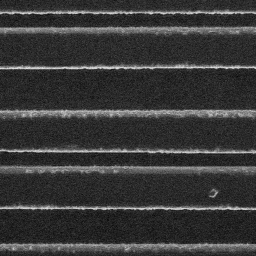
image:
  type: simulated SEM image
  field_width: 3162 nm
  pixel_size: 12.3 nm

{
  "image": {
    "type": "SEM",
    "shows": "lines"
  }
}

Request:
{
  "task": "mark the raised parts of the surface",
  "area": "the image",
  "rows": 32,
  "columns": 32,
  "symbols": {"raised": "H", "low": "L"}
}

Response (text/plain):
HHHHHHHHHHHHHHHHHHHHHHHHHHHHHHHH
HHHHHHHHHHHHHHHHHHHHHHHHHHHHHHHH
LLLLLLLLLLLLLLLLLLLLLLLLLLLLLLLL
LLLLLLLLLLLLLLLLLLLLLLLLLLLLLLLL
HHHHHHHHHHHHHHHHHHHHHHHHHHHHHHHH
HHHHHHHHHHHHHHHHHHHHHHHHHHHHHHHH
HHHHHHHHHHHHHHHHHHHHHHHHHHHHHHHH
HHHHHHHHHHHHHHHHHHHHHHHHHHHHHHHH
HHHHHHHHHHHHLHHLLLLLLLLLLLLLLLLL
LLLLLLLLLLLLLLLLLLLLLLLLLLLLLLLL
LLLLLLLLLLLLLLLLLLLLLLLLLLLLLLLL
LLLLLLLLLLLLLLLLLLLLLLLLLLLLLLLL
LLLLLLLLLLLLLLLLLLLLLLLLLLLLLLLL
LLLLLLLLLLLLLLLLLLLLLLLLLLLLLLLL
HHHHHHHHHHHHHHHHHHHHHHHHHHHHHHHH
HHHHHHHHHHHHHHHHHHHHHHHHHHHHHHHH
HHHHHHHHHHHHHHHHHHHHHHHHHHHHHHHH
HHHHHHHHHHHHHHHHHHHHHHHHHHHHHHHH
HHHHHHHHHHHHHHHHHHHHHHHHHHHHHHHH
LLLLLLLLLLLLLLLLLLLLLLLLLLLLLLLL
LLLLLLLLLLLLLLLLLLLLLLLLLLLLLLLL
HHHHHHHHHHHHHHHHHHHHHHHHHHHHHHHH
HHHHHHHHHHHHHHHHHHHHHHHHHHHHHHHH
HHHHHHHHHHHHHHHHHHHHHHHHHHHHHHHH
HHHHHHHHHHHHHHHHHHHHHHHHHHHHHHHH
HHHHHHHHHHHHHHHHHHHHHHHHHHHHHHHH
LLLLLLLLLLLLLLLLLLLLLLLLLLLLLLLL
LLLLLLLLLLLLLLLLLLLLLLLLLLLLLLLL
LLLLLLLLLLLLLLLLLLLLLLLLLLLLLLLL
LLLLLLLLLLLLLLLLLLLLLLLLLLLLLLLL
LLLLLLLLLLLLLLLLLLLLLLLLLLLLLLLL
HHHHHHHHHHHHHHHHHHHHHHHHHHHHHHHH